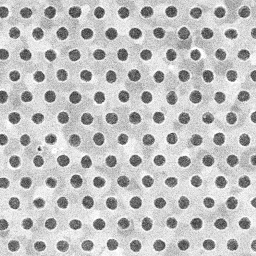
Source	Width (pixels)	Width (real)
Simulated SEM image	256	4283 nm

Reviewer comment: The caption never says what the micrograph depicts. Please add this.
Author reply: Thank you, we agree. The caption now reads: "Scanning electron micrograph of a regular array of holes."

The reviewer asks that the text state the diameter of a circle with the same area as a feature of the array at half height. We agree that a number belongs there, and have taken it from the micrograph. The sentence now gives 217 nm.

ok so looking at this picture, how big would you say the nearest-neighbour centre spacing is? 392 nm